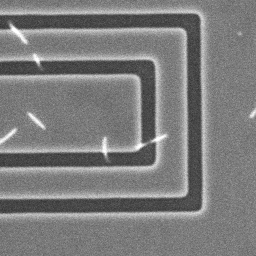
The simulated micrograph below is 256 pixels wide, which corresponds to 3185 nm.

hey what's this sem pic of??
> groups of lines, slits or small figures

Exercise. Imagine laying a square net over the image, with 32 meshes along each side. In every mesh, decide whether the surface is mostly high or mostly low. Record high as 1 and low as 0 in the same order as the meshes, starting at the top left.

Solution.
11111111111111111111111111111111
11111111111111111111111111111111
00000000000000000000000001111111
00000000000000000000000001111111
11111111111111111111111001111111
11111111111111111111111001111111
11111111111111111111111001111111
11111111000000000001111001111111
00000000000000000001111001111111
00001111111111111000111001111111
11111111111111111000111001111111
11111111111111111000111001111111
11111111111111111000111001111111
11111111111111111000111001111111
11111111111111111000111001111111
11111111111111111100111001111111
11111111111111111100111001111111
11111111111111111101111001111111
11111111111111111000111001111111
00000000000000000000111001111111
00000000000000000001111001111111
11111111111111111111111001111111
11111111111111111111111001111111
11111111111111111111111001111111
11111111111111111111111001111111
00000000000000000000000001111111
00000000000000000000000011111111
11111111111111111111111111111111
11111111111111111111111111111111
11111111111111111111111111111111
11111111111111111111111111111111
11111111111111111111111111111111